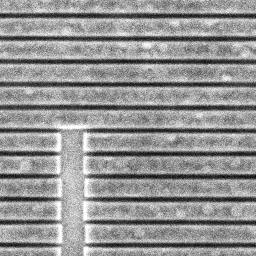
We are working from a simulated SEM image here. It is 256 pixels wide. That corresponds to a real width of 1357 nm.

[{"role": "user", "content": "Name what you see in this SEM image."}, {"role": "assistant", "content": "parallel lines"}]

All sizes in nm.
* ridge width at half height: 92.1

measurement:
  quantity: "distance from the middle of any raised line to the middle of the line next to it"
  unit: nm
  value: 122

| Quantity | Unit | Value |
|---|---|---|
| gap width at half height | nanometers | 29.2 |